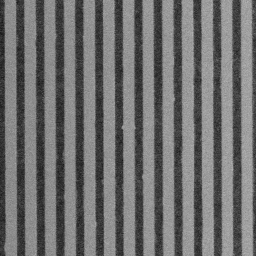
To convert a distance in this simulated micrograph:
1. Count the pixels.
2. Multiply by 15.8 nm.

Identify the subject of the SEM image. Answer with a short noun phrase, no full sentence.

parallel lines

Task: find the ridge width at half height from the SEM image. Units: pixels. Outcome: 11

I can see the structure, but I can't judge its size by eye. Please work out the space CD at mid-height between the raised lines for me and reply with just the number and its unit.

139 nanometers